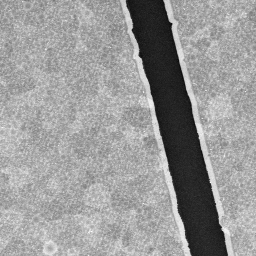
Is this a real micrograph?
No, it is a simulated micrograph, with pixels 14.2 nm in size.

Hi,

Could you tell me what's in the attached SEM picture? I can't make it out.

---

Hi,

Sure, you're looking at one or a few lines or trenches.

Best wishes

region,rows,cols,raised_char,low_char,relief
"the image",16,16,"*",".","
********...*****
********...*****
********...*****
*********..*****
*********...****
*********...****
*********...****
**********..****
**********...***
**********...***
**********...***
***********..***
***********...**
***********...**
***********...**
************..**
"